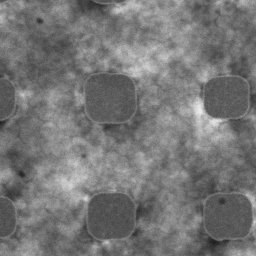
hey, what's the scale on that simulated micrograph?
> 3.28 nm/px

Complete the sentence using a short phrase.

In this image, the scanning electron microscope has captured raised bodies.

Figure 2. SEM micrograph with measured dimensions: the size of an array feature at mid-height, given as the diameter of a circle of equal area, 170 nm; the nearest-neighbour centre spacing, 382 nm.